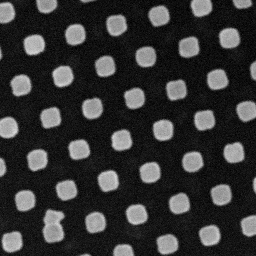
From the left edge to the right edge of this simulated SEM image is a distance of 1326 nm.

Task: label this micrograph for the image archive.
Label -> a regular array of raised bodies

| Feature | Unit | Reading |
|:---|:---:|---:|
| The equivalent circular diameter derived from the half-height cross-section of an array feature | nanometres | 103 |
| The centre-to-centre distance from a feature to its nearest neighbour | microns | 0.22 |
